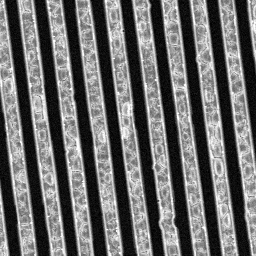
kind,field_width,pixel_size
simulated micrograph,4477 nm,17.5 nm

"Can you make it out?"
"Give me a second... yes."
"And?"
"parallel lines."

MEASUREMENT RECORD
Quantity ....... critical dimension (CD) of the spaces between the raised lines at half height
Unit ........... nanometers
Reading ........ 256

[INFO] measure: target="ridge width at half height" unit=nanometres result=239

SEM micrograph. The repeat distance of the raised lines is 0.497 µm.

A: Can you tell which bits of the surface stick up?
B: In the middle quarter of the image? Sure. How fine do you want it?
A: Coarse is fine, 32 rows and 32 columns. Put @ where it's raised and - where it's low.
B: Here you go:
@----@@@----@@@@----@@@----@@@--
@----@@@@---@@@@----@@@----@@@--
@@---@@@@----@@@----@@@----@@@--
@@----@@@----@@@----@@@----@@@--
@@----@@@----@@@----@@@----@@@--
@@----@@@----@@@----@@@@---@@@--
@@----@@@----@@@@---@@@@----@@@-
@@----@@@----@@@@----@@@----@@@-
@@----@@@----@@@@----@@@----@@@-
@@----@@@@---@@@@----@@@----@@@-
@@@---@@@@----@@@----@@@----@@@-
@@@----@@@----@@@----@@@----@@@-
@@@----@@@----@@@----@@@----@@@-
@@@----@@@----@@@----@@@@---@@@@
@@@----@@@----@@@----@@@@----@@@
@@@----@@@----@@@----@@@@----@@@
@@@----@@@----@@@@---@@@@----@@@
@@@----@@@@---@@@@----@@@----@@@
@@@@---@@@@----@@@----@@@----@@@
@@@@----@@@----@@@----@@@----@@@
-@@@----@@@----@@@----@@@@---@@@
-@@@----@@@----@@@----@@@@---@@@
-@@@----@@@----@@@----@@@@----@@
-@@@----@@@----@@@@---@@@@----@@
-@@@----@@@----@@@@---@@@@----@@
-@@@----@@@@---@@@@---@@@@----@@
-@@@@---@@@@----@@@----@@@----@@
-@@@@----@@@----@@@----@@@----@@
--@@@----@@@----@@@----@@@----@@
--@@@----@@@----@@@----@@@-----@
--@@@----@@@----@@@----@@@@----@
--@@@----@@@----@@@@---@@@@----@